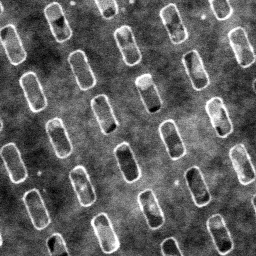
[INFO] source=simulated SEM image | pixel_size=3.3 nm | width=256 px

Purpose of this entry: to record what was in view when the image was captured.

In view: a regular array of raised bodies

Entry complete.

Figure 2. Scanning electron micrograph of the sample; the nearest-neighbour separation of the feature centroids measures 168 nanometers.